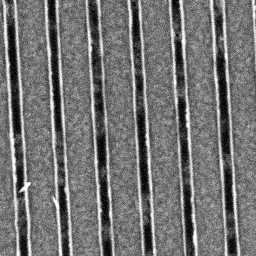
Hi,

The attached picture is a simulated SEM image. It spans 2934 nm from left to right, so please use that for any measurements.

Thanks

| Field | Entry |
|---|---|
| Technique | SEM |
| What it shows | parallel lines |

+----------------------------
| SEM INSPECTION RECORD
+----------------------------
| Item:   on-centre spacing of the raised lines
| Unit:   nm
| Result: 476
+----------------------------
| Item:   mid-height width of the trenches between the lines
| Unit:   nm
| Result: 333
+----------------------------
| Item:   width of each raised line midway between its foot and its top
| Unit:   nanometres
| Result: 143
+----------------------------